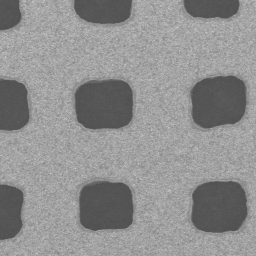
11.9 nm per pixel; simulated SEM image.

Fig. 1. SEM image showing holes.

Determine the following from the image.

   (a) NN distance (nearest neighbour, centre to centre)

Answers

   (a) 1230 nanometres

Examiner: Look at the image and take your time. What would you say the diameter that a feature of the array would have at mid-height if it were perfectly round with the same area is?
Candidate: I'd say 670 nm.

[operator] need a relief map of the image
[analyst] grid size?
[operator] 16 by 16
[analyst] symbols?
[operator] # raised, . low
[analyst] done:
.####...####...#
.###############
################
################
################
..###...####...#
..###...####...#
..###...####...#
################
################
################
######..#####..#
.####...####...#
.####...####...#
.############.##
################